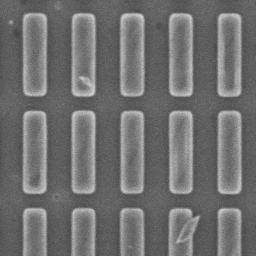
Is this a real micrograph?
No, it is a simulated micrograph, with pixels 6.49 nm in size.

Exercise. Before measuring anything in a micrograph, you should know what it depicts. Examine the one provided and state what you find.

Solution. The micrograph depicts wiring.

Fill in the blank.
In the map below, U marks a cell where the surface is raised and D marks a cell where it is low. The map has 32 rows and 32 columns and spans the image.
DDDDDDDDDDDDDDDDDDDDDDDDDDDDDDDD
DDDDDDDDDDDDDDDDDDDDDDDDDDDDDDDD
DDDUUUDDDUUUDDDUUUDDDUUUDDDUUUDD
DDDUUUDDDUUUDDDUUUDDDUUUDDDUUUDD
DDDUUUDDDUUUDDDUUUDDDUUUDDDUUUDD
DDDUUUDDDUUUDDDUUUDDDUUUDDDUUUDD
DDDUUUDDDUUUDDDUUUDDDUUUDDDUUUDD
DDDUUUDDDUUUDDDUUUDDDUUUDDDUUUDD
DDDUUUDDDUUUDDDUUUDDDUUUDDDUUUDD
DDDUUUDDDUUUDDDUUUDDDUUUDDDUUUDD
DDDUUUDDDUUUDDDUUUDDDUUUDDDUUUDD
DDDUUUDDDUUUDDDUUUDDDUUUDDDUUUDD
DDDDDDDDDDDDDDDDDDDDDDDDDDDDDDDD
DDDDDDDDDDDDDDDDDDDDDDDDDDDDDDDD
DDDUUUDDDUUUDDDUUUDDDUUUDDDUUUDD
DDDUUUDDDUUUDDDUUUDDDUUUDDDUUUDD
DDDUUUDDDUUUDDDUUUDDDUUUDDDUUUDD
DDDUUUDDDUUUDDDUUUDDDUUUDDDUUUDD
DDDUUUDDDUUUDDDUUUDDDUUUDDDUUUDD
DDDUUUDDDUUUDDDUUUDDDUUUDDDUUUDD
DDDUUUDDDUUUDDDUUUDDDUUUDDDUUUDD
DDDUUUDDDUUUDDDUUUDDDUUUDDDUUUDD
DDDUUUDDDUUUDDDUUUDDDUUUDDDUUUDD
DDDUUUDDDUUUDDDUUUDDDUUUDDDUUUDD
DDDDDDDDDDDDDDDDDDDDDDDDDDDDDDDD
DDDDDDDDDDDDDDDDDDDDDDDDDDDDDDDD
DDDUUUDDDUUUDDDUUUDDDUUUDDDUUUDD
DDDUUUDDDUUUDDDUUUDDDUUUUDDUUUDD
DDDUUUDDDUUUDDDUUUDDDUUUDDDUUUDD
DDDUUUDDDUUUDDDUUUDDDUUUDDDUUUDD
DDDUUUDDDUUUDDDUUUDDDUUUDDDUUUDD
DDDUUUDDDUUUDDDUUUDDDUUUDDDUUUDD